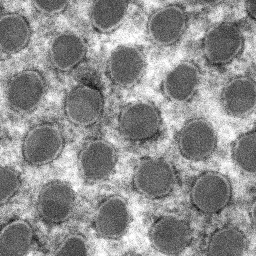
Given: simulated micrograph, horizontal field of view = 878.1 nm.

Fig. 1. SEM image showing a regular array of raised bodies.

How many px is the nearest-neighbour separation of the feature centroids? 56.8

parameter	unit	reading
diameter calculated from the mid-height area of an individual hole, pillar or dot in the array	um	0.127